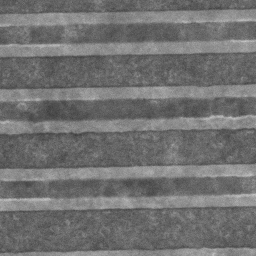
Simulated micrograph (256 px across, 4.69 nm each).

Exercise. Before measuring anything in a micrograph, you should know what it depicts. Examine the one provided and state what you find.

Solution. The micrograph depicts one or a few lines or trenches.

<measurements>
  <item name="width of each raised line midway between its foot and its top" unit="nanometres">146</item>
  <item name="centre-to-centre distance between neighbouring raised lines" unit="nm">362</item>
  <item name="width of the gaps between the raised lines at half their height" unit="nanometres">216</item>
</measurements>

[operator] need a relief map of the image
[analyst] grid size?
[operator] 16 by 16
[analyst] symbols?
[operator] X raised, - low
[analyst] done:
----------------
XXXXXXXXXXXXXXXX
XXXXXXXXXXXXXXXX
----------------
----------------
----------------
XXXXXXXXXXXXXXXX
XXXXXXXXXXXXXXXX
----------------
----------------
----------------
XXXXXXXXXXXXXXXX
XXXXXXXXXXXXXXXX
----------------
----------------
----------------